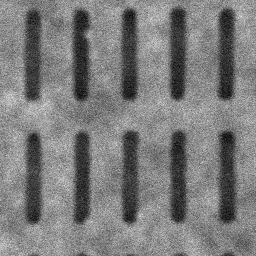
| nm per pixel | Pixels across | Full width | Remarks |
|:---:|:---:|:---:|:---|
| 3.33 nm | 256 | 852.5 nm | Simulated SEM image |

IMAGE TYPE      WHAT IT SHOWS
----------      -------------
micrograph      a regular array of holes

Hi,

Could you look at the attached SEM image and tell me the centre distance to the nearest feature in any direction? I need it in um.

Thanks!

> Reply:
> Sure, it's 0.161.